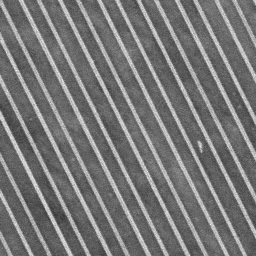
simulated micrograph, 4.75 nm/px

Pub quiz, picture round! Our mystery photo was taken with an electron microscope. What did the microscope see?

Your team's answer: parallel lines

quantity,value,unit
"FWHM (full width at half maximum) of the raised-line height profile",13.8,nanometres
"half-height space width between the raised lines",64.7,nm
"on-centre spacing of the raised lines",82.9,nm